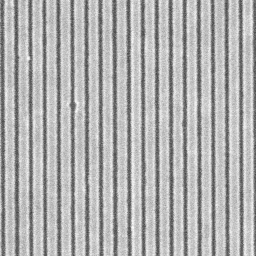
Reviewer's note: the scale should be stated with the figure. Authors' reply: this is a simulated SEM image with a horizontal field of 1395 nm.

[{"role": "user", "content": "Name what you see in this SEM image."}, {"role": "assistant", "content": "parallel lines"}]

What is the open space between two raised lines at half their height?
28.6 nanometres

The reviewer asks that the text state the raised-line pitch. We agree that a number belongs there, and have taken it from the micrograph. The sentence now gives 76.4 nm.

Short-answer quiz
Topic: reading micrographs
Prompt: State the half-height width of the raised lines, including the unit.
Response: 47 nanometres